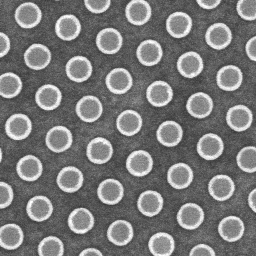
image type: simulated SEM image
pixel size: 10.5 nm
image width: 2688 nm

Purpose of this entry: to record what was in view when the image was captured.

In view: a regular array of raised bodies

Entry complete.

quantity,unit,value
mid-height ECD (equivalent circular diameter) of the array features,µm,0.25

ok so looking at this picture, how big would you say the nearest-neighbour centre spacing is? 431 nm